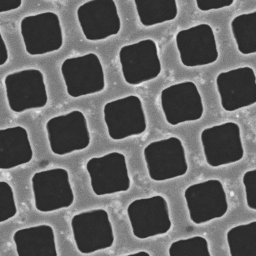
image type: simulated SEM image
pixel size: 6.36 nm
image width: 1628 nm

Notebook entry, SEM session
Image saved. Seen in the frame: a regular array of holes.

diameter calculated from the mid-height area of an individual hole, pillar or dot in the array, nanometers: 267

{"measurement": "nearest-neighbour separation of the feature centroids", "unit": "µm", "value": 0.367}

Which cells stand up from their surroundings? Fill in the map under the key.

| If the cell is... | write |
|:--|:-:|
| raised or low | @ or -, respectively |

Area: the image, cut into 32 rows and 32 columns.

---@@@@@@@@---@@@-----@@@----@@@
@@@@@@@@@@-----@@-----@@@@@@@@@@
@@@----@@@-----@@@---@@@@@@@@---
@@@-----@@-----@@@@@@@@@--@@@---
@@@-----@@@---@@@@@@@@-----@@---
-@@-----@@@@@@@@@--@@@-----@@@--
-@@@--@@@@@@@@@-----@@-----@@@--
-@@@@@@@----@@@-----@@@----@@@@@
@@@@@@@@-----@@-----@@@@@@@@@@-@
@----@@@-----@@@----@@@@@@@-----
@-----@@-----@@@@@@@@@--@@@-----
@-----@@@---@@@@@@@@-----@@-----
@-----@@@@@@@@@--@@@-----@@@----
@---@@@@@@@@@-----@@-----@@@--@@
@@@@@@@@--@@@-----@@@----@@@@@@@
@@@@@@-----@@-----@@@@@@@@@@-@@@
---@@@-----@@@----@@@@@@@-----@@
----@@-----@@@@@@@@@@-@@@-----@@
----@@----@@@@@@@@-----@@-----@@
----@@@@@@@@@--@@@-----@@@----@@
---@@@@@@@@-----@@-----@@@--@@@@
@@@@@---@@@-----@@@----@@@@@@@@-
@@@@-----@@-----@@@@@@@@@@-@@@--
-@@@-----@@@----@@@@@@@@----@@@-
--@@-----@@@@@@@@@@@@@@-----@@@-
--@@-----@@@@@@@-----@@-----@@@-
--@@@@@@@@@--@@@-----@@@----@@@@
-@@@@@@@@-----@@-----@@@--@@@@@@
@@@@--@@@-----@@@----@@@@@@@@---
@@-----@@-----@@@--@@@@@@@@@----
@@-----@@@----@@@@@@@@----@@@---
@@-----@@@-@@@@@@@@@@-----@@@---